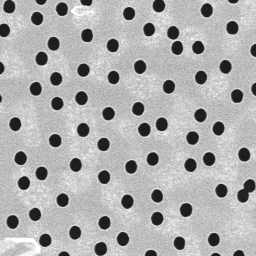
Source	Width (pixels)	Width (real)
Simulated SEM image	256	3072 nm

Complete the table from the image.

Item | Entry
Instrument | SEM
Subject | a regular array of holes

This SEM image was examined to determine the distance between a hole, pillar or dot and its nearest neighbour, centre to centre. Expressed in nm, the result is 300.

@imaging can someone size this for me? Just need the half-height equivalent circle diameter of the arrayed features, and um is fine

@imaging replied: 0.156